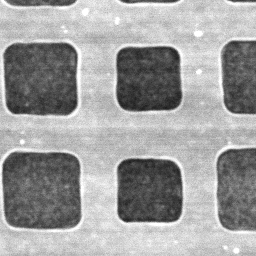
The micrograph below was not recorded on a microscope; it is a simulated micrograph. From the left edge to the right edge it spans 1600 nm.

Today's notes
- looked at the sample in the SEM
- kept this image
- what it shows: holes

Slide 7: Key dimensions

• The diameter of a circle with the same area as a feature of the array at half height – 77.1 px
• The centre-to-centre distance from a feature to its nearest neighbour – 672 nanometres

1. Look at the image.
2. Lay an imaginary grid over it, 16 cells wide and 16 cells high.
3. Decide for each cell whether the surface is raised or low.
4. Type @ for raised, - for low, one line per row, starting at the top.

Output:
@@@@@@@@@@@@@@@@
@@@@@@@@@@@@@@@@
@@@@@@@@@@@@@@@-
-----@@----@@@--
-----@@----@@@--
-----@@----@@@--
-----@@----@@@--
@@@@@@@@@@@@@@@@
@@@@@@@@@@@@@@@@
@---@@@@@@@@@@--
-----@@----@@@--
-----@@----@@@--
-----@@----@@@--
-----@@----@@@--
@@@@@@@@@@@@@@@@
@@@@@@@@@@@@@@@@